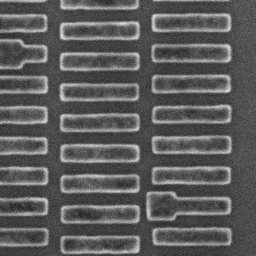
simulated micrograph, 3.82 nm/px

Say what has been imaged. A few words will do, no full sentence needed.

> wiring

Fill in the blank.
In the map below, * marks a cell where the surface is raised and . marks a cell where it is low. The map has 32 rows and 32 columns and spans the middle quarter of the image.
*******************.............
.....*..........................
................................
......................**********
......................**********
******************....**********
******************....**********
..****************..............
.*****************..............
................................
................................
.......................********.
......................*********.
*******************...**********
*******************....*********
*******************.............
*****************...............
................................
.......................*********
......................**********
*****************.....**********
******.************...**********
******.**.*********.............
******.************.............
................................
................................
......................**********
......................**********
*******.***********...***..*.***
*******.***********...**********
*******************.............
*******************.............